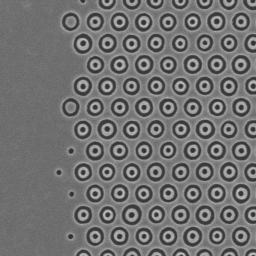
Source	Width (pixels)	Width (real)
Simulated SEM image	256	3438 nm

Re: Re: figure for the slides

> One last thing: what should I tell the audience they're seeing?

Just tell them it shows a regular array of ring-shaped grooves with a dot in the middle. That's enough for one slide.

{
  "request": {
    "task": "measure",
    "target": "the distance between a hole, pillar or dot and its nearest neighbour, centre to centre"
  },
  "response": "0.321 microns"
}